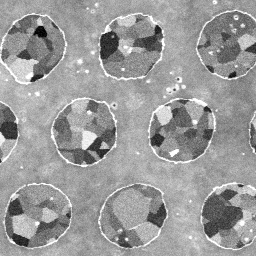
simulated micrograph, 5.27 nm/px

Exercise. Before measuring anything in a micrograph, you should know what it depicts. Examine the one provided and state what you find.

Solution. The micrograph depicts raised bodies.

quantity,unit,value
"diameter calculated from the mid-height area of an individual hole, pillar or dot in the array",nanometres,346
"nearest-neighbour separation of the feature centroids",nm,509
